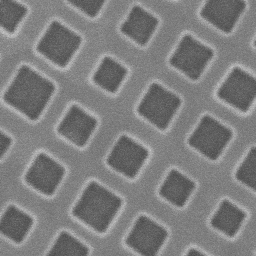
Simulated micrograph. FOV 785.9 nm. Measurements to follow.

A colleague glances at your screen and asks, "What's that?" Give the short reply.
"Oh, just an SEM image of a regular array of holes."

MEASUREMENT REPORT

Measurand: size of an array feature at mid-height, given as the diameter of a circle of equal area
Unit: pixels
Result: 40.9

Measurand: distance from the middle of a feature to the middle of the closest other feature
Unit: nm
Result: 179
